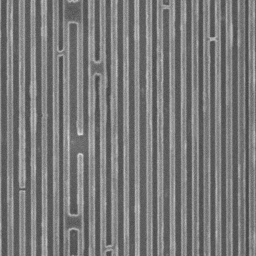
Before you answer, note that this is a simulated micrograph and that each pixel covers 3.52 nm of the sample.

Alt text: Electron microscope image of parallel lines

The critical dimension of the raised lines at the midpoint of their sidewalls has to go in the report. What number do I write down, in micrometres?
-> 0.0198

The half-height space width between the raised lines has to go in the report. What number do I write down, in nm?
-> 19.8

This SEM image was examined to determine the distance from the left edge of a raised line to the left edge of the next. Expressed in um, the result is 0.0406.